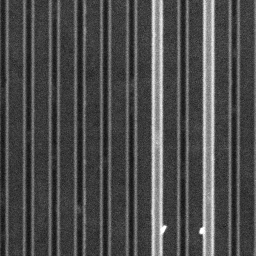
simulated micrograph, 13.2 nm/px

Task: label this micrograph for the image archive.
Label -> parallel lines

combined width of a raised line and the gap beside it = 25.7 px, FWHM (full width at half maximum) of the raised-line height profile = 0.114 microns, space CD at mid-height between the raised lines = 228 nanometres